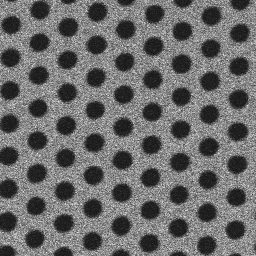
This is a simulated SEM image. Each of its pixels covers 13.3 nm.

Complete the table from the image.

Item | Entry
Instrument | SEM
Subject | a regular array of holes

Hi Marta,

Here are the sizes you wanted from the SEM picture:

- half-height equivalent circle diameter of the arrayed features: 253 nanometres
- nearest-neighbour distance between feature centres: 433 nm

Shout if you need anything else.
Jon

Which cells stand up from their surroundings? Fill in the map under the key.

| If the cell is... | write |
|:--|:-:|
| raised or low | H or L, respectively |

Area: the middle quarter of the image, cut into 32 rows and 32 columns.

LLLHHHHHHHHHHLLLLHHHHHHHHHHLLLLL
HHHHHHHLLHHHHHLLHHHHHHHHHHHLLLLH
HHHHHHLLLLHHHHHHHHHHLLLLHHHHHHHH
HHHHHHLLLLHHHHHHHHHHLLLLLHHHHHHH
HHHHHHLLLLHHHHHHHHHHLLLLHHHHHHHH
LLLHHHHLLHHHHHLLHHHHLLLLHHHHHHHH
LLLHHHHHHHHHHLLLLHHHHHHHHHHHLLLH
LLLHHHHHHHHHHLLLLHHHHHHHHHHLLLLL
LLLHHHHHHHHHHLLLLHHHHHHHHHHLLLLL
LHHHHHHLLHHHHLLLHHHHHHHHHHHLLLLH
HHHHHHLLLLHHHHHHHHHHLLLLHHHHHHHH
HHHHHLLLLLHHHHHHHHHHLLLLHHHHHHHH
HHHHHHLLLLHHHHHHHHHHLLLLHHHHHHHH
LLHHHHLLLHHHHHHHHHHHLLLLHHHHHHHH
LLLHHHHHHHHHHLLLLHHHHHHHHHHHLLLH
LLLHHHHHHHHHLLLLLHHHHHHHHHHLLLLH
LLLHHHHHHHHHLLLLLHHHHHHHHHHLLLLL
LHHHHHHLLHHHHLLLHHHHHHHHHHHLLLLH
HHHHHHLLLLHHHHHHHHHHLLLLHHHHLLHH
HHHHHLLLLLHHHHHHHHHHLLLLHHHHHHHH
HHHHHLLLLLHHHHHHHHHLLLLLHHHHHHHH
LLHHHHLLLHHHHHHHHHHHLLLLHHHHHHHH
LLLHHHHHHHHHHLLLLHHHHLHHHHHHLLHH
LLLHHHHHHHHHLLLLLHHHHHHHHHHLLLLH
LLLHHHHHHHHHLLLLLHHHHHHHHHLLLLLH
LLHHHHHLHHHHHLLLHHHHHHHHHHHLLLLH
HHHHHHLLLLHHHHHHHHHHLLLHHHHLLLHH
HHHHHLLLLLHHHHHHHHHHLLLLHHHHHHHH
HHHHHLLLLLHHHHHHHHHLLLLLHHHHHHHH
LHHHHHLLLHHHHHHHHHHLLLLLHHHHHHHH
LLHHHHHHHHHHHLLLHHHHLLLHHHHHLHHH
LLLHHHHHHHHHLLLLLHHHHHHHHHHLLLLH